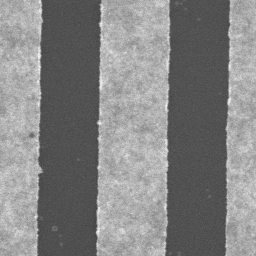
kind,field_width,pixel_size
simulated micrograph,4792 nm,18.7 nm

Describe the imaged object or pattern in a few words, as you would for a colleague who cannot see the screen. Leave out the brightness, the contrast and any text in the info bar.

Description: one or a few lines or trenches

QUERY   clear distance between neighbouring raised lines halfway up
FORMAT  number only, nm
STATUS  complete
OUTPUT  1130